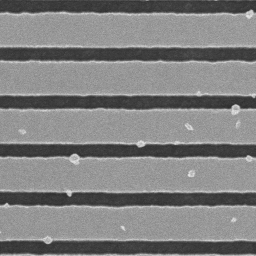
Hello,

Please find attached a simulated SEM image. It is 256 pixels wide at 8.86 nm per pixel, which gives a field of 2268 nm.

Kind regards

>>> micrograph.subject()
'lines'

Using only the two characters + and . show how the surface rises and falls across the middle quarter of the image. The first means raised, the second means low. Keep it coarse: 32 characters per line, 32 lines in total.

++++++++++++++++++++++++++++++++
++++++++++++++++++++++++++++++++
++++++++++++++++++++++++++++++++
++++++++++++++++++++++++++++++++
++++++++++++++++++++++++++++++++
++++++++++++++++++++++++++++++++
++++++++++++++++++++++++++++++++
++++++++++++++++++++++++++++++++
................................
................................
................................
++++++++++++++++++++++++++++++++
++++++++++++++++++++++++++++++++
++++++++++++++++++++++++++++++++
++++++++++++++++++++++++++++++++
++++++++++++++++++++++++++++++++
++++++++++++++++++++++++++++++++
++++++++++++++++++++++++++++++++
++++++++++++++++++++++++++++++++
++++++++++++++++++++++++++++++++
..................++............
................................
................................
++++++++++++++++++++++++++++++++
++++++++++++++++++++++++++++++++
++++++++++++++++++++++++++++++++
++++++++++++++++++++++++++++++++
++++++++++++++++++++++++++++++++
++++++++++++++++++++++++++++++++
++++++++++++++++++++++++++++++++
++++++++++++++++++++++++++++++++
++++++++++++++++++++++++++++++++